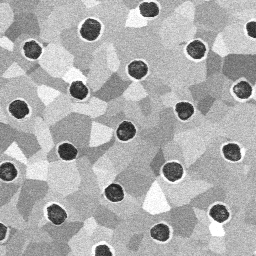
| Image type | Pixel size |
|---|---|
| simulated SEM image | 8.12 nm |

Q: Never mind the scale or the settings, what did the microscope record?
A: a regular array of holes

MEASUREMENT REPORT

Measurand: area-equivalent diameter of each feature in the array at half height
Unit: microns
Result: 0.162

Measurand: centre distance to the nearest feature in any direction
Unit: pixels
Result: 61.5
